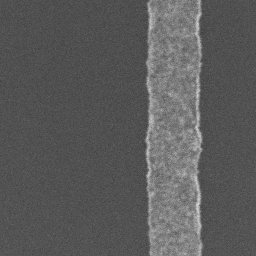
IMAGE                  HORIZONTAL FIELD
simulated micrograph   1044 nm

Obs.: one or a few lines or trenches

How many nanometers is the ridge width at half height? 203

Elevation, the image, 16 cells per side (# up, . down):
.........###....
.........###....
.........###....
.........###....
.........###....
.........###....
.........###....
..........##....
.........###....
.........###....
.........###....
.........###....
.........###....
.........###....
.........###....
.........####...